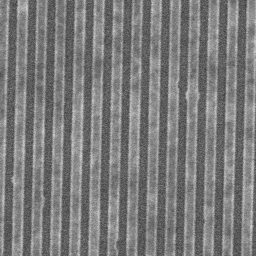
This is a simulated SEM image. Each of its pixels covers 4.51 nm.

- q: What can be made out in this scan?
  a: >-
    parallel lines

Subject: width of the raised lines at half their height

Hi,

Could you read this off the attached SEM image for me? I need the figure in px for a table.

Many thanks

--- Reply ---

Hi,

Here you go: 8.87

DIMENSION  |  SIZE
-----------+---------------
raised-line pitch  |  86.2 nm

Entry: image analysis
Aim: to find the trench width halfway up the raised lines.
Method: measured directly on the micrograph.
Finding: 47.9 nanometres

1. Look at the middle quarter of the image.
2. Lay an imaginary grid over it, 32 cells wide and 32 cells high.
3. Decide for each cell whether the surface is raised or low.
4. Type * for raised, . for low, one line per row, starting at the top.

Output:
...**..**...**...**...**...*...*
...**..**...**...**...**...*...*
...**..**...**...**...**...**..*
...*...**...**...**...**...**..*
...**..**...**...**...**...**..*
...**..**...**...**...**...*...*
...**..**...**...**...**..**...*
...**..**...**...**...**..**...*
...**..**...**...**...**..**...*
...**..**...**...**...**..**...*
...**..**...**...**..**...**...*
...**..**...**...**..**...**...*
..**...**...**...**..**...**...*
..**...**...**...**..**...**...*
..**...**...**...**..**...**...*
..**...**...**...**..**...**...*
..**...**...**...**..**...**...*
..**...**...**...**..**...**...*
..**...**...**...**..**...**...*
..**...**...**...**..**...**...*
..**...**...**...**..**...**...*
..**...**...**...**..**...**...*
..**...**...**...**..**...**...*
..**...**...**...*...**...**...*
..**...**...**..**...**...**...*
..**...**...**..**...**...**...*
..**...**...**..**...**...**...*
..**...**...**..**...**...**...*
..**...**...**..**...**...**...*
..**...**...*...**...**...**...*
..**...**...*...**...**...**...*
..**...**...*...**...**...**...*